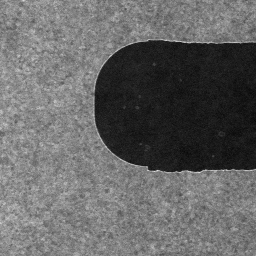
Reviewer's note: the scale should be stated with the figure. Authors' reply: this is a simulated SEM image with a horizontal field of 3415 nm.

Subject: one or a few lines or trenches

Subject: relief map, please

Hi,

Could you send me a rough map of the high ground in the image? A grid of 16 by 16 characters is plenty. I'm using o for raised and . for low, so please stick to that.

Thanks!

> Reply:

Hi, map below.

oooooooooooooooo
oooooooooooooooo
oooooooooooooooo
ooooooo.........
oooooo..........
oooooo..........
oooooo..........
oooooo..........
oooooo..........
ooooooo.........
ooooooooo.......
oooooooooooooooo
oooooooooooooooo
oooooooooooooooo
oooooooooooooooo
oooooooooooooooo